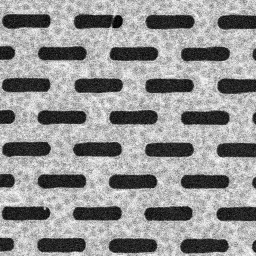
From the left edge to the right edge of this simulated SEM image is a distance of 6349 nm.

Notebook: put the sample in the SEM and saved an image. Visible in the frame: a regular array of holes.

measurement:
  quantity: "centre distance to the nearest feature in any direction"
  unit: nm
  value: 1180